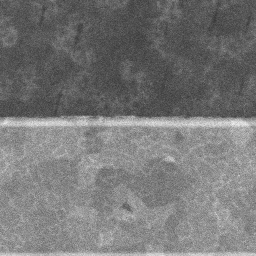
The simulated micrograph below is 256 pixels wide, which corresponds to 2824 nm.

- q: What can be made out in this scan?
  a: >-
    one or a few lines or trenches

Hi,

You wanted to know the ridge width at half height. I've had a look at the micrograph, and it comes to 1460 nm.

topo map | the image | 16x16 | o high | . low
................
................
................
................
................
................
................
................
oooooooooooooooo
oooooooooooooooo
oooooooooooooooo
oooooooooooooooo
oooooooooooooooo
oooooooooooooooo
oooooooooooooooo
oooooooooooooooo